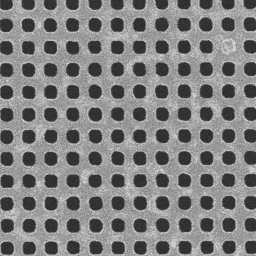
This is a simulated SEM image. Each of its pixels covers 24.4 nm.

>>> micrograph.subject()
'a regular array of holes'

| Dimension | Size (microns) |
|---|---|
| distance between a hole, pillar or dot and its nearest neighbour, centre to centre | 0.538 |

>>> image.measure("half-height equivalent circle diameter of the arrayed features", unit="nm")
350